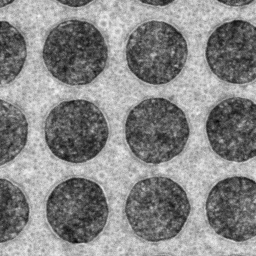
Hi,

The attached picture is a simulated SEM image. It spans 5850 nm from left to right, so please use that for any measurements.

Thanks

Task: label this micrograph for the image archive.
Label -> holes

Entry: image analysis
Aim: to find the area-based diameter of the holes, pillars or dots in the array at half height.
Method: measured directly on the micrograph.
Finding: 1.47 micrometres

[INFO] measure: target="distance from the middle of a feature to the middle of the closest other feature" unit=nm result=1790